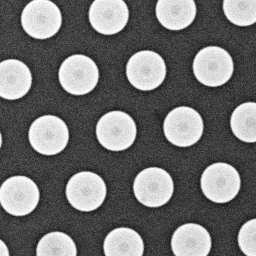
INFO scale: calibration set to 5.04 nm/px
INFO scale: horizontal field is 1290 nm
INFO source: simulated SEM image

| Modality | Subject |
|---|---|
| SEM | an array of small figures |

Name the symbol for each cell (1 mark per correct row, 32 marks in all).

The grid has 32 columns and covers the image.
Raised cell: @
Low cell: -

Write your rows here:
----@@@-----@@@@----@@@@----@@@@
---@@@@----@@@@@----@@@@----@@@@
---@@@@@---@@@@@----@@@@-----@@@
---@@@@-----@@@------@@---------
----@@--------------------------
--------------------------------
------------------@------@@@----
--------@@@-----@@@@----@@@@@---
@@@-----@@@@----@@@@@---@@@@@---
@@@@---@@@@@----@@@@@---@@@@@---
@@@@----@@@@-----@@@-----@@@----
@@@------@@---------------------
--------------------------------
----------------------@@------@@
-------------@@@-----@@@@----@@@
----@@@@----@@@@@----@@@@----@@@
----@@@@----@@@@@----@@@@----@@@
----@@@@----@@@@@----@@@@-----@@
----@@@@-----@@@----------------
--------------------------------
---------------------------@----
------------------@@@-----@@@@--
-@@@-----@@@@----@@@@----@@@@@--
@@@@@---@@@@@----@@@@@---@@@@@--
@@@@@---@@@@@----@@@@-----@@@---
@@@@@----@@@@-----@@------------
-@@@----------------------------
--------------------------------
----------------------@@@-----@@
------@@-----@@@@-----@@@@----@@
@----@@@@----@@@@@---@@@@@----@@
@----@@@@----@@@@@----@@@@----@@